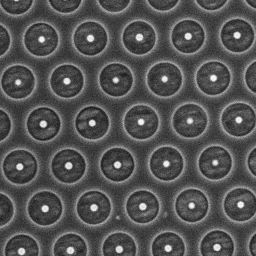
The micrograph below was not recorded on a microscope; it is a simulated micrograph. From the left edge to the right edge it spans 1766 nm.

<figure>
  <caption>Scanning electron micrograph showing an array of small figures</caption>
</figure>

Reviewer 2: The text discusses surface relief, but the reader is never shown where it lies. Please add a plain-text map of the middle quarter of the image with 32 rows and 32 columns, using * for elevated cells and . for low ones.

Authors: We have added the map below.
...*******.....*******......****
....*****........****........***
.....****........****........***
.....****........****....*....**
*....****........****.........**
.....****........****........***
....******......******.......***
...********....********.....****
.*******************************
********************************
******************...********...
****......******......******....
***..**....****........****.....
***........****.........***.....
***...**...****....*....***....*
***.*......****.........***.....
***........****........*****....
****......******.......******...
*****....********....**********.
********************************
*************************.******
...********....********.....****
....******.......*****.......***
.....****........*****........**
.....****....*....***....*....**
**...****....*....***....*....**
.....****.........****........**
.....*****.......*****.......***
....*******.....*******.....****
...**********.******************
********************************
*******************.**********..